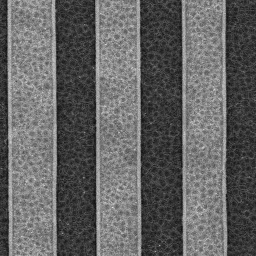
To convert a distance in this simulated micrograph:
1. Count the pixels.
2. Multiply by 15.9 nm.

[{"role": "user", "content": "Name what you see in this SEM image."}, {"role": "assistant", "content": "one or a few lines or trenches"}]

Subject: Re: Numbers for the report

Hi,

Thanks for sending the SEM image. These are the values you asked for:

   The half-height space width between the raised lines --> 0.705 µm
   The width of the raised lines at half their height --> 650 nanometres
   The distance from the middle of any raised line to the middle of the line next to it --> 1.36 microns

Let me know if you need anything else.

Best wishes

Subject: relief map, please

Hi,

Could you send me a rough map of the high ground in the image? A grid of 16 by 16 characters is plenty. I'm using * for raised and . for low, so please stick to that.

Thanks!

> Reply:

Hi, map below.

.**...***..***..
.**...***..***..
.**...***...**..
.**...***...**..
.**...***...**..
.**...***...**..
.**...***...**..
.**...***...**..
.**...***...**..
.**...***...**..
.**...***...**..
.**...***...**..
.**...***...**..
.**...***...**..
.**...***...**..
.**...***...**..